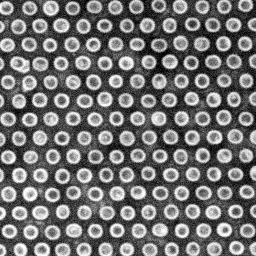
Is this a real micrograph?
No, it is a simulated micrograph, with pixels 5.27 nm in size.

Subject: a regular array of raised bodies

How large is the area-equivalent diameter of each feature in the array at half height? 69.3 nanometres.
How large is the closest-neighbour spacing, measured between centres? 109 nanometers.